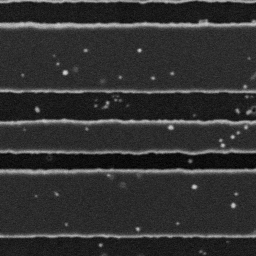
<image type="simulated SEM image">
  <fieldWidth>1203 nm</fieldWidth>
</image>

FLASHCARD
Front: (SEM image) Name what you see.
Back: lines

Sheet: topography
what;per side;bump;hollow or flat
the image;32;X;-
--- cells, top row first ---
--------------------------------
--------------------------------
--------------------------------
XXXXXXXXXXXXXXXXXXXXXXXXXXXXXXXX
XXXXXXXXXXXXXXXXXXXXXXXXXXXXXXXX
XXXXXXXXXXXXXXXXXXXXXXXXXXXXXXXX
XXXXXXXXXXXXXXXXXXXXXXXXXXXXXXXX
XXXXXXXXXXXXXXXXXXXXXXXXXXXXXXXX
XXXXXXXXXXXXXXXXXXXXXXXXXXXXXXXX
XXXXXXXXXXXXXXXXXXXXXXXXXXXXXXXX
XXXXXXXXXXXXXXXXXXXXXXXXXXXXXXXX
--X-XX-XXXX--X-XXXXXXXXX-XXXXXXX
--------------------------------
--------------------------------
--------------------------------
XXXXXXXXXXXXXXXXXXXXXXXXXXXXXXXX
XXXXXXXXXXXXXXXXXXXXXXXXXXXXXXXX
XXXXXXXXXXXXXXXXXXXXXXXXXXXXXXXX
XXXXXXXXXXXXXXXXXXXXXXXXXXXXXXXX
--------------------------------
--------------------------------
XXXXXXXXXXXXXXXXXXXXXXXXXXXXXXXX
XXXXXXXXXXXXXXXXXXXXXXXXXXXXXXXX
XXXXXXXXXXXXXXXXXXXXXXXXXXXXXXXX
XXXXXXXXXXXXXXXXXXXXXXXXXXXXXXXX
XXXXXXXXXXXXXXXXXXXXXXXXXXXXXXXX
XXXXXXXXXXXXXXXXXXXXXXXXXXXXXXXX
XXXXXXXXXXXXXXXXXXXXXXXXXXXXXXXX
XXXXXXXXXXXXXXXXXXXXXXXXXXXXXXXX
XXXXXXXXXXXXXXXXXXXXXXXXXXXXXXXX
--------------------------------
--------------------------------